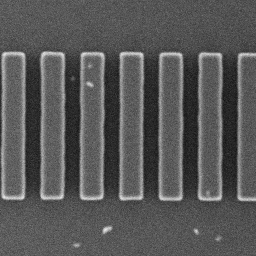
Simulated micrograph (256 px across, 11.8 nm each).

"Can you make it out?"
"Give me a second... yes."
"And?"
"groups of lines, slits or small figures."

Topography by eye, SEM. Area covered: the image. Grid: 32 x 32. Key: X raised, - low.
--------------------------------
--------------------------------
--------------------------------
--------------------------------
--------------------------------
--------------------------------
--------------------------------
XXX--XXX--XXX--XXX--XXX--XXX--XX
XXX--XXX--XXX--XXX--XXX--XXX--XX
XXX--XXX--XXX--XXX--XXX--XXX--XX
XXX--XXX--XXX--XXX--XXX--XXX--XX
XXX--XXX--XXX--XXX--XXX--XXX--XX
XXX--XXX--XXX--XXX--XXX--XXX--XX
XXX--XXX--XXX--XXX--XXX--XXX--XX
XXX--XXX--XXX--XXX--XXX--XXX--XX
XXX--XXX--XXX--XXX--XXX--XXX--XX
XXX--XXX--XXX--XXX--XXX--XXX--XX
XXX--XXX--XXX--XXX--XXX--XXX--XX
XXX--XXX--XXX--XXX--XXX--XXX--XX
XXX--XXX--XXX--XXX--XXX--XXX--XX
XXX--XXX--XXX--XXX--XXX--XXX--XX
XXX--XXX--XXX--XXX--XXX--XXX--XX
XXX--XXX--XXX--XXX--XXX--XXX--XX
XXX--XXX--XXX--XXX--XXX--XXX--XX
XXX--XXX--XXX--XXX--XXX--XXX--XX
--------------------------------
--------------------------------
--------------------------------
--------------------------------
--------------------------------
--------------------------------
--------------------------------